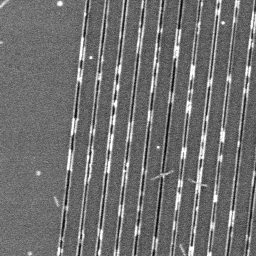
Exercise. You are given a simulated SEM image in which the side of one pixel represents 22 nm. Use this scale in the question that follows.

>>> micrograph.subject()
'parallel lines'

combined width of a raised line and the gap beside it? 407 nanometres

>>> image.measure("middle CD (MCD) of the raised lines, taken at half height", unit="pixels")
3.73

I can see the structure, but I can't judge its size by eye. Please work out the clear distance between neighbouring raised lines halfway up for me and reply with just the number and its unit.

328 nanometers